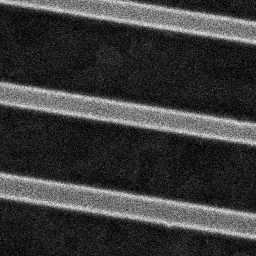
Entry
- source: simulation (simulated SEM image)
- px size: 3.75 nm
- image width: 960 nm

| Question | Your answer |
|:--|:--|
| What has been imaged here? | one or a few lines or trenches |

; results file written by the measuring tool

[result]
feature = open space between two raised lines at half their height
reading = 281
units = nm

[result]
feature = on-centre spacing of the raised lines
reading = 93.7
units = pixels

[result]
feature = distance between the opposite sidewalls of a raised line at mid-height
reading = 77.4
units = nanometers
